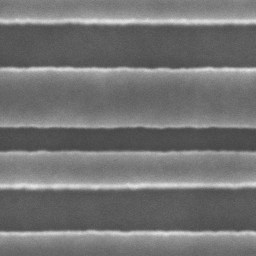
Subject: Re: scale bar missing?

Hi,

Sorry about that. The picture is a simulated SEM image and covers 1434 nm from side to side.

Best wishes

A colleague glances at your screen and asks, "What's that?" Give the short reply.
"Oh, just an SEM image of lines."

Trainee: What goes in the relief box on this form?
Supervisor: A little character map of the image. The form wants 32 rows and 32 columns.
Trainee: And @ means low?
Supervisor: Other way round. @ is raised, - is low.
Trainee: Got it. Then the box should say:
@@@@@@@@@@@@@@@@@@@@@@@@@@@@@@@@
@@@@@@@@@@@@@@@@@@@@@@@@@@@@@@@@
@@@@@@@@@@@@@@@@@@@@@@@@@@@@@@@@
--------------------------------
--------------------------------
--------------------------------
--------------------------------
--------------------------------
--------------------------------
@@@@@@@@@@@@@@@@@@@@@@@@@@@@@@@@
@@@@@@@@@@@@@@@@@@@@@@@@@@@@@@@@
@@@@@@@@@@@@@@@@@@@@@@@@@@@@@@@@
@@@@@@@@@@@@@@@@@@@@@@@@@@@@@@@@
@@@@@@@@@@@@@@@@@@@@@@@@@@@@@@@@
@@@@@@@@@@@@@@@@@@@@@@@@@@@@@@@@
@@@@@@@@@@@@@@@@@@@@@@@@@@@@@@@@
--------------------------------
--------------------------------
--------------------------------
@@@@@@@@@@@@@@@@@@@@@@@@@@@@@@@@
@@@@@@@@@@@@@@@@@@@@@@@@@@@@@@@@
@@@@@@@@@@@@@@@@@@@@@@@@@@@@@@@@
@@@@@@@@@@@@@@@@@@@@@@@@@@@@@@@@
--------------------------------
--------------------------------
--------------------------------
--------------------------------
--------------------------------
--------------------------------
@@@@@@@@@@@@@@@@@@@@@@@@@@@@@@@@
@@@@@@@@@@@@@@@@@@@@@@@@@@@@@@@@
@@@@@@@@@@@@@@@@@@@@@@@@@@@@@@@@